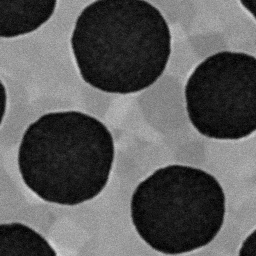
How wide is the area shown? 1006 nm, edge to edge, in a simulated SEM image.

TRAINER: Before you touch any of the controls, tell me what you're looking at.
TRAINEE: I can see holes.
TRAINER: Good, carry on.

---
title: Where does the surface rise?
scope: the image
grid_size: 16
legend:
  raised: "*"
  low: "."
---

...**.....*****.
...**.....******
****.......*****
*****......**...
*****.....**....
******...***....
************....
**....******....
*......******..*
*......*********
*......***..****
**.....**.....**
***...**......**
********......**
..*******.....**
...*******..***.